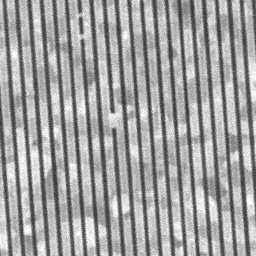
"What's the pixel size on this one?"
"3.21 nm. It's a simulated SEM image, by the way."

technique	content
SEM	parallel lines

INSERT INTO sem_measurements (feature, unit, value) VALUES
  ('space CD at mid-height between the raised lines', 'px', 5.23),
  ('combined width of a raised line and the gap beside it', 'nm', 40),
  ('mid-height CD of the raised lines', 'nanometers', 24.8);